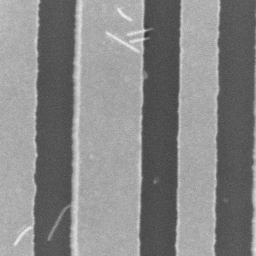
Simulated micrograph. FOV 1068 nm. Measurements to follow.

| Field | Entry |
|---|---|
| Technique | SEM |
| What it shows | lines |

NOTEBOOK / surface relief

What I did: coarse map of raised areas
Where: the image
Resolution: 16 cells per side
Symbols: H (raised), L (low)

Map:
HHLLLHHHHLLHHHLL
HHLLLHHHHLLHHHLL
HHLLLHHHHLLHHHLL
HHLLLHHHHLLHHHLL
HHLLLHHHHLLHHHLL
HHLLLHHHHLLHHHLL
HHLLLHHHHLLHHHLL
HHLLLHHHHLLHHHLL
HHLLLHHHHLLHHHLL
HHLLLHHHHLLHHHLL
HHLLLHHHHLLHHLLL
HHLLLHHHHLLHHLLL
HHLLLHHHHLLHHLLL
HHLLLHHHHLLHHLLL
HHLLLHHHHLLHHLLL
HHLLLHHHHLLHHLLL